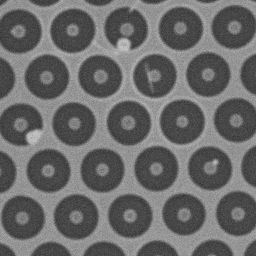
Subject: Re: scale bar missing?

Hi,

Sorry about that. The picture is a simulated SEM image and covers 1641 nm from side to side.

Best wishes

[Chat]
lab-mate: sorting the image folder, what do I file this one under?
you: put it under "an array of small figures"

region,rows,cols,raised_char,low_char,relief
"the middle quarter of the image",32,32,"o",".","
.ooo..........oooo..........ooo.
.ooo..........ooo...........oo..
.oo............oo....ooo....oo..
..o............oo....ooo....oo..
.ooo...........oo...........ooo.
.ooo..........oooo..........ooo.
.oooo.........oooo.........ooooo
oooooo.......oooooo.......oooooo
oooooooo...oooooooooo....ooooooo
oo.ooooooooooo.....ooooooo......
......oooooo........ooooo.......
.......oooo..........ooo........
........ooo...........oo........
........ooo...........oo........
........oo............oo........
........ooo...........oo........
........ooo...........oo........
........ooo..........oooo.......
.......ooooo.........oooo.......
......ooooooo......ooooooo......
o...ooooooooooo..ooooo...ooooooo
ooooooo.....oooooooo.......ooooo
oooooo........ooooo.........oooo
.oooo.........oooo..........ooo.
.ooo...........ooo...........oo.
..oo.....o.....oo............oo.
..oo....ooo....oo............oo.
..oo.....o.....ooo..........ooo.
..oo...........ooo..........ooo.
.oooo.........oooo..........oooo
oooooo........ooooo........ooooo
ooooooo......oooooooo....ooooooo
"